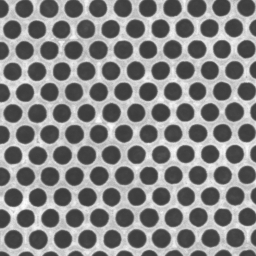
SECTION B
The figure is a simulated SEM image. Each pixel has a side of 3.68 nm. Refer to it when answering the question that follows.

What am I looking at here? a regular array of holes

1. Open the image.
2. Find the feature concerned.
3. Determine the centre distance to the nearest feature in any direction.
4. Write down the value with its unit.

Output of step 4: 88.6 nm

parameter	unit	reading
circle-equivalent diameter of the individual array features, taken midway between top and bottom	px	18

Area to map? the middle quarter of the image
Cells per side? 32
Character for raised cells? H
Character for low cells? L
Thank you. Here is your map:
LHHHLLLHHHLLLLHHLLLLHHLLLLHHLLLL
LLHLLLLLHHLLLLHHLLLLHHLLLLHHLLLL
LHHLLLLLHHLLLLHHLLLLHHLLLLHHLLLL
LHHHLLLHHHLLLHHHHLLHHHHLLHHHHLLH
HHHHHHHHHHHHHHHHHHHHHHHHHHHHHHHH
HLLLHHHLLLHHHLLLLHHLLLLHHLLLLHHH
LLLLLHHLLLLHHLLLLHHLLLLHHLLLLHHL
LLLLLHLLLLLHHLLLLHHLLLLHHLLLLHHL
HLLLHHHLLLLHHLLLHHHLLLLHHHLLLHHH
HHHHHHHHHHHHHHHHHHHHHHHHHHHHHHHH
LHHHLLLHHHHLLLHHHLLLHHHLLLHHHLLL
LHHHLLLLHHLLLLHHLLLLHHLLLLHHLLLL
LLHLLLLLHHLLLLHHLLLLHHLLLLLHLLLL
LHHHLLLLHHLLLLHHLLLLHHLLLLHHHLLL
HHHHHLHHHHHHHHHHHHHHHHHHHHHHHHHH
HHLHHHHHLLHHHHLLHHHHLLHHHHLLLHHH
HLLLLHHLLLLHHLLLLHHLLLLHHLLLLHHL
LLLLLHHLLLLHHLLLLHHLLLLHHLLLLLHL
LLLLLHHLLLLHHLLLLHHLLLLHHLLLLHHH
HLLLHHHHLHHHHHHHHHHHLLHHHHHLHHHH
HHHHHHHHHHHLHHHHHHLHHHHHLHHHHHLH
LHHHLLLLHHLLLLHHLLLLHHLLLLHHLLLL
LLHLLLLLHLLLLLHHLLLLHHLLLLLHLLLL
LLHLLLLLHHLLLLHHLLLLHHLLLLHHLLLL
LHHHLLLHHHLLLHHHHLLHHHHLLLHHHLLL
HHHHHHHHHHHHHHHHHHHHHHHHHHHHHHHH
HLLLHHHLLLLHHLLLLHHHLLLHHHLLLHHH
LLLLLHLLLLLHHLLLLHHLLLLHHLLLLLHL
LLLLLHHLLLLHHLLLLHHLLLLHHLLLLLHL
HLLLHHHLLLHHHLLLLHHHLLLHHHLLLHHH
HHHHHHHHHHHHHHHHHHHHHHHHHHHHHHHH
LHHHLLLHHHLLLHHHHLLHHHHLLLHHHLLL